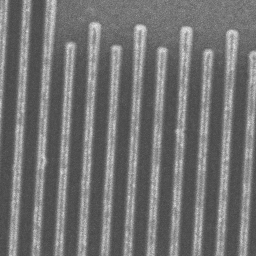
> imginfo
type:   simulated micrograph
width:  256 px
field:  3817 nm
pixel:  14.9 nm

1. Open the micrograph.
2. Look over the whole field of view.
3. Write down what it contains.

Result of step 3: parallel lines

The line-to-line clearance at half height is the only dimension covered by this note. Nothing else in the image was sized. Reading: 0.218 um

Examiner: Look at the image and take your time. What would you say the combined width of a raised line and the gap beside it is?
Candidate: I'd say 0.343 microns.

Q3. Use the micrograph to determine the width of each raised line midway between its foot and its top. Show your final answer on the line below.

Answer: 8.61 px